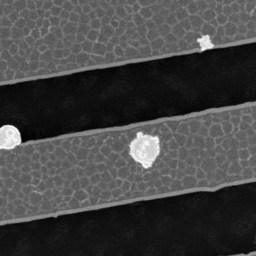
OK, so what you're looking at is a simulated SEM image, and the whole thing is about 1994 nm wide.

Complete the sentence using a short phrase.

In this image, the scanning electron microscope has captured one or a few lines or trenches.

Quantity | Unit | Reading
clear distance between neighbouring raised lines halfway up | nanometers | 492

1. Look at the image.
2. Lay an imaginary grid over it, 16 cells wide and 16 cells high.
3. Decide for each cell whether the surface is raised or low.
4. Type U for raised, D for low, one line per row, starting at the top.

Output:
UUUUUUUUUUUUUUUU
UUUUUUUUUUUUUUUU
UUUUUUUUUUUUUUUU
UUUUUUUUUUDDDDDD
UUUUDDDDDDDDDDDD
DDDDDDDDDDDDDDDD
DDDDDDDDDDDDDDDD
DDDDDDDDDDUUUUUU
UDDDUUUUUUUUUUUU
UUUUUUUUUUUUUUUU
UUUUUUUUUUUUUUUU
UUUUUUUUUUUUUUDD
UUUUUUUUDDDDDDDD
UUUDDDDDDDDDDDDD
DDDDDDDDDDDDDDDD
DDDDDDDDDDDDDDDD